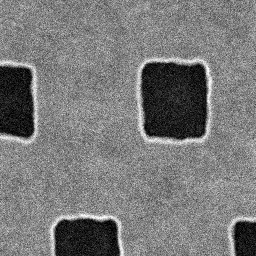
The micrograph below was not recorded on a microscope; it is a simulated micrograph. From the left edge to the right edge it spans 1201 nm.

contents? holes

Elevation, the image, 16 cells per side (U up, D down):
UUUUUUUUUUUUUUUU
UUUUUUUUUUUUUUUU
UUUUUUUUUUUUUUUU
UUUUUUUUUUUUUUUU
DDUUUUUUUDDDDUUU
DDUUUUUUUDDDDUUU
DDUUUUUUUDDDDUUU
DDUUUUUUUDDDDUUU
UDUUUUUUUDDDDUUU
UUUUUUUUUUUUUUUU
UUUUUUUUUUUUUUUU
UUUUUUUUUUUUUUUU
UUUUUUUUUUUUUUUU
UUUUUUUUUUUUUUUU
UUUDDDDUUUUUUUUD
UUUDDDDUUUUUUUUD